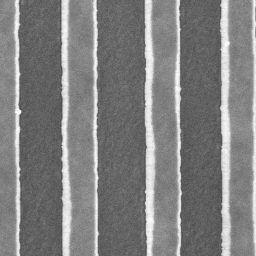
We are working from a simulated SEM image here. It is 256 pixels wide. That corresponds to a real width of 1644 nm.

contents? lines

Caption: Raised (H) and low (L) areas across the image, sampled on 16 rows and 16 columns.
HLLLHHLLLHHLLLHH
HLLLHHLLLHHLLLHH
HLLLHHLLLHHLLLHH
HLLLHHLLLHHLLLHH
HLLLHHLLLHHLLLHH
HLLLHHLLLHHLLLHH
HLLLHHLLLHHLLLHH
HLLLHHLLLHHLLLHH
HLLLHHLLLHHLLLHH
HLLLHHLLLHHLLLHH
HLLLHHLLLHHLLLHH
HLLLHHLLLHHLLLHH
HLLLHHLLLHHLLLHH
HLLLHHLLLHHLLLHH
HLLLHHLLLHHLLLHH
HLLLHHLLLHHLLLHH